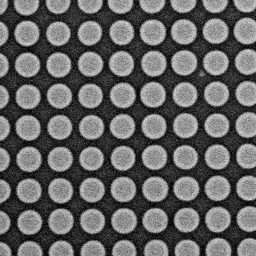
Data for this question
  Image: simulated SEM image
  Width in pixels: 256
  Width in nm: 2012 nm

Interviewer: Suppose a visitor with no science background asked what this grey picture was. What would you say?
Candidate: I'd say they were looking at an array of small figures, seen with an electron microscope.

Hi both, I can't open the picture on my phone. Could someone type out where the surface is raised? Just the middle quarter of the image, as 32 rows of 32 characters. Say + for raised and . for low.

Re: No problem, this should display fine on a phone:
++..++++++.++++++...+++++..+++++
+...+++++...+++++...+++++...++++
+....+++.....+++.....+++.....++.
................................
................................
.....+++.....++++...++++....++++
+...+++++...+++++..++++++...++++
++..+++++...++++++.++++++..+++++
++..++++++..++++++.++++++..+++++
++..+++++...+++++...+++++...++++
+....+++.....+++.....+++.....++.
................................
.............................++.
+....++++....++++...+++++...++++
++..++++++..+++++...+++++...++++
++..++++++..++++++..+++++..+++++
++..++++++..+++++...+++++...++++
+...+++++...+++++...+++++...++++
.....+++......++......++........
................................
......................++.....++.
+....++++....++++...+++++...++++
++..+++++...++++++..++++++.+++++
++..++++++..++++++..++++++.+++++
++..++++++..++++++..+++++...++++
++...++++...+++++...+++++...++++
................................
................................
..............++......++.....+++
+....++++...+++++...+++++...++++
++..++++++..++++++..++++++..++++
++..++++++..++++++..++++++..++++